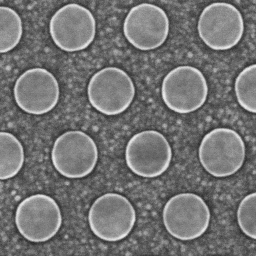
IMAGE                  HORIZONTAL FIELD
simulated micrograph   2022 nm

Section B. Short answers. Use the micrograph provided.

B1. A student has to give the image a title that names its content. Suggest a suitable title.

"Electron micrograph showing a regular array of raised bodies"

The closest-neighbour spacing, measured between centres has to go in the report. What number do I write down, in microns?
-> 0.577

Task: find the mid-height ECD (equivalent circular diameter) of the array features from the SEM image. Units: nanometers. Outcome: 353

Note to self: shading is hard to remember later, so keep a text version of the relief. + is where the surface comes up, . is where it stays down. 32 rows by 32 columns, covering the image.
................................
++.....++++.....++++.....+++++..
++....++++++....+++++....+++++..
+++...++++++....+++++....+++++..
++.....+++++....+++++....+++++..
++.....++++......+++......+++...
................................
................................
......................++.......+
...++++.....++++.....++++.....++
..+++++....+++++....++++++...+++
..+++++....++++++...++++++....++
..+++++....+++++.....++++.....++
...+++......++++......+++......+
................................
................................
..................+........++...
++.....++++.....+++++.....++++..
+++....+++++....+++++....+++++..
+++....+++++....+++++....++++++.
+++....+++++....+++++....+++++..
++......+++......+++......+++...
................................
................................
....+........++.......+++......+
...++++.....++++.....+++++....++
..+++++....++++++....+++++....++
..+++++....++++++....+++++....++
..+++++.....++++.....+++++....++
...+++......++++......+++......+
................................
................................